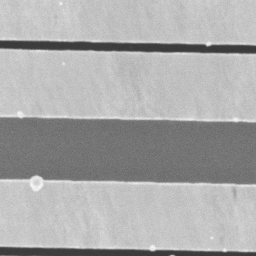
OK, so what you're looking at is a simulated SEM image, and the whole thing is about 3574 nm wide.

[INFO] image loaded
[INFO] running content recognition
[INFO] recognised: lines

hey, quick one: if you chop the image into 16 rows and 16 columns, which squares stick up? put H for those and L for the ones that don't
HHHHHHHHHHHHHHHH
HHHHHHHHHHHHHHHH
LHHHHHHHHHHHHHHH
HHHHHHHHHHHHHHHH
HHHHHHHHHHHHHHHH
HHHHHHHHHHHHHHHH
HHHHHHHHHHHHHHHH
LLLLLLLLLLLLHHHH
LLLLLLLLLLLLLLLL
LLLLLLLLLLLLLLLL
LLLLLLLLLLLLLLLL
HHHHHHHHHHHHLLLL
HHHHHHHHHHHHHHHH
HHHHHHHHHHHHHHHH
HHHHHHHHHHHHHHHH
LLLLLHHHHHHHHHHH